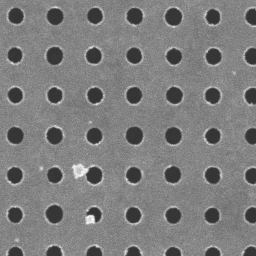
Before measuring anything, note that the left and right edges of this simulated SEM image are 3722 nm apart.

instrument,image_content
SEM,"a regular array of holes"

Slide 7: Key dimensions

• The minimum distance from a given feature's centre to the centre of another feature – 568 nm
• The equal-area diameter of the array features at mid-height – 237 nm